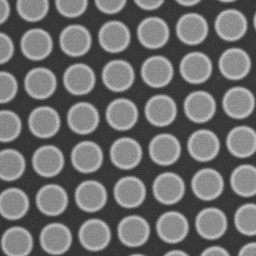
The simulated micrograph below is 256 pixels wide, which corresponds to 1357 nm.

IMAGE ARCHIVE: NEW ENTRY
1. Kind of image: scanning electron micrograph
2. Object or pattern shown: an array of small figures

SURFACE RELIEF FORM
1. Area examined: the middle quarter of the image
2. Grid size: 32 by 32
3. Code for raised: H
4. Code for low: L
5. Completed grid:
LLHHHHLLLLHHHHHHHLLLHHHHHHHLLHHH
LHHHHHHLLLHHHHHHHLLHHHHHHHHLLHHH
HHHHHHHLLLHHHHHHHLLHHHHHHHHLLHHH
HHHHHHHHLLHHHHHHHLLLHHHHHHHLLLHH
HHHHHHHHLLHHHHHHHLLLHHHHHHLLLLLH
HHHHHHHLLLHHHHHHLLLLLLHHHLLLLLLL
LHHHHHHLLLLLHHHLLLLLLLLLLLLLLLLL
LLHHHLLLLLLLLLLLLLLLLLLLLLLLLLLL
LLLLLLLLLLLLLLLLLLLLLLHHHHHLLLLH
LLLLLLLLLLLLHHHHHLLLLHHHHHHLLLHH
LLHHHHHLLLLHHHHHHHLLHHHHHHHHLLHH
LHHHHHHHLLLHHHHHHHLLHHHHHHHHLLHH
LHHHHHHHHLLHHHHHHHLLHHHHHHHHLLLH
LHHHHHHHHLLHHHHHHHLLLHHHHHHHLLLH
LHHHHHHHHLLHHHHHHHLLLLHHHHHLLLLL
LHHHHHHHLLLLHHHHHLLLLLLLHLLLLLLL
LLHHHHHLLLLLLLHLLLLLLLLLLLLLLLLL
LLLLHLLLLLLLLLLLLLLLLLLLLLLLLLLL
LLLLLLLLLLLLLLLHLLLLLLLHHHHHLLLH
LLLLLHLLLLLLLHHHHHLLLLHHHHHHLLLH
LLLHHHHHHLLLHHHHHHHLLHHHHHHHHLLH
LLHHHHHHHLLLHHHHHHHLLHHHHHHHHLLH
LLHHHHHHHHLLHHHHHHHLLLHHHHHHHLLL
LLHHHHHHHHLLHHHHHHHLLLHHHHHHLLLL
LLHHHHHHHLLLHHHHHHHLLLLHHHHLLLLL
LLLHHHHHHLLLLHHHHHLLLLLLLLLLLLLL
LLLLHHHHLLLLLLLLLLLLLLLLLLLLLLLL
LLLLLLLLLLLLLLLLLLLLLLLLLHHHLLLL
LLLLLLLLLLLLLLLHHHLLLLLHHHHHHLLL
LLLLLHHHLLLLLLHHHHHLLLLHHHHHHHLL
LLLLHHHHHHLLLHHHHHHHLLHHHHHHHHLL
LLLHHHHHHHLLLHHHHHHHLLHHHHHHHHLL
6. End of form